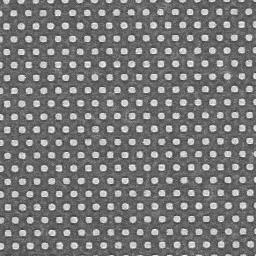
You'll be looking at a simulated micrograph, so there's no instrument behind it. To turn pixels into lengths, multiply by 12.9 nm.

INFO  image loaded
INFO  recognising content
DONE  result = a regular array of raised bodies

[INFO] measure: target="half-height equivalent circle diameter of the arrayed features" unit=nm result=85.1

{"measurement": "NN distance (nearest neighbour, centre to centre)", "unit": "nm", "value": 185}